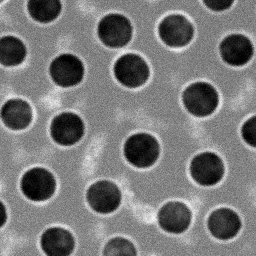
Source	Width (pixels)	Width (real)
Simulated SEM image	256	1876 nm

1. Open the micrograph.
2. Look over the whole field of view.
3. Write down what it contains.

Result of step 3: a regular array of holes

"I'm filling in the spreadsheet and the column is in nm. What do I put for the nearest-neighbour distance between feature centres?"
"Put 427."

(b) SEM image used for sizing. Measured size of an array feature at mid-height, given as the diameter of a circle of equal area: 36.2 pixels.